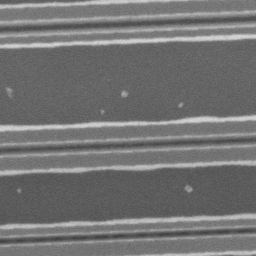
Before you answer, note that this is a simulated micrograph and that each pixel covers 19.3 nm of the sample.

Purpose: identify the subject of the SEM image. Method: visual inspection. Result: lines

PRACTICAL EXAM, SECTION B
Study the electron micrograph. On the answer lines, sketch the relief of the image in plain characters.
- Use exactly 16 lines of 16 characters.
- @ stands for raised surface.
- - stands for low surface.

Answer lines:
@@@@@@@@@@@@@@@@
@@@@@@@@@@@@@@@@
@@@@@@@@@-------
----------------
----------------
----------------
----------------
---------------@
@@@@@@@@@@@@@@@@
@@@@@@@@@@@@@@@@
@@@@@@----------
----------------
----------------
----------------
@@@@@@@@@@@@@@@@
@@@@@@@@@@@@@@@@